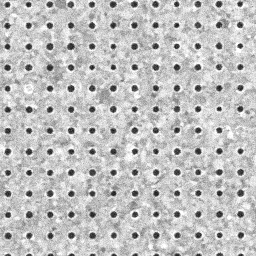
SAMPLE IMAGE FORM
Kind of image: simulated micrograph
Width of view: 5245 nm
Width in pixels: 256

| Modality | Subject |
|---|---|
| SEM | a regular array of holes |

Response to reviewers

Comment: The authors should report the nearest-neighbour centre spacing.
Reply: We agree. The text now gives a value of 20.8 px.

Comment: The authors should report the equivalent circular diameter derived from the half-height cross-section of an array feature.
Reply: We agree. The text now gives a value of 7.22 pixels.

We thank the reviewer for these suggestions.